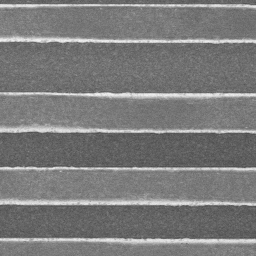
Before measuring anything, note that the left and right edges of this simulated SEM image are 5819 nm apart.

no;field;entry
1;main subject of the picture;lines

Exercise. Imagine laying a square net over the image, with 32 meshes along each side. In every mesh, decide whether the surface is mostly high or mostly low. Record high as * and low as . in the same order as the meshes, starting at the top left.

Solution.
................................
********************************
********************************
********************************
********************************
................................
................................
................................
................................
................................
................................
................................
********************************
********************************
********************************
********************************
........****.*******************
................................
................................
................................
................................
********************************
********************************
********************************
********************************
...*..***.*.********************
................................
................................
................................
................................
********************************
********************************